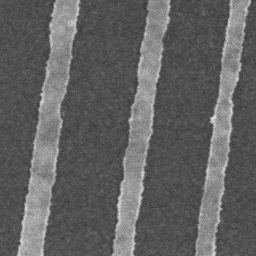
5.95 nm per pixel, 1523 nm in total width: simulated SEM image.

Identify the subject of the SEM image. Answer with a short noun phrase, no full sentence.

one or a few lines or trenches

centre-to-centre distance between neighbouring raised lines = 510 nm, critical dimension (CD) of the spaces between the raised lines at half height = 0.392 microns